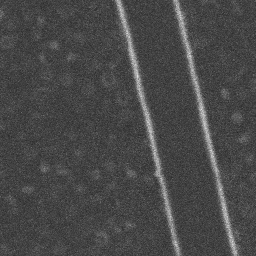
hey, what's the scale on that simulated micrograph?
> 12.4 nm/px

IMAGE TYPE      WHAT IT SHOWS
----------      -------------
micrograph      one or a few lines or trenches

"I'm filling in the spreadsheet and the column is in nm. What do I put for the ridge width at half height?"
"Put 689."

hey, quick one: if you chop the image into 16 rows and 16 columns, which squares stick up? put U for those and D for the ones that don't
DDDDDDDUUUUDDDDD
DDDDDDDDUUUDDDDD
DDDDDDDDUUUUDDDD
DDDDDDDDUUUUDDDD
DDDDDDDDDUUUDDDD
DDDDDDDDDUUUDDDD
DDDDDDDDDUUUUDDD
DDDDDDDDDUUUUDDD
DDDDDDDDDUUUUDDD
DDDDDDDDDDUUUDDD
DDDDDDDDDDUUUDDD
DDDDDDDDDDUUUUDD
DDDDDDDDDDUUUUDD
DDDDDDDDDDDUUUDD
DDDDDDDDDDDUUUDD
DDDDDDDDDDDUUUUD